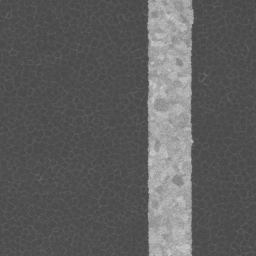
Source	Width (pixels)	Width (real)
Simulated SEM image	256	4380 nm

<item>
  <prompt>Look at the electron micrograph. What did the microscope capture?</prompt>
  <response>one or a few lines or trenches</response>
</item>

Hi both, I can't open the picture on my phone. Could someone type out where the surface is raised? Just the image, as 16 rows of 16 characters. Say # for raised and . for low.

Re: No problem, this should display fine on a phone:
.........###....
.........###....
.........###....
.........###....
.........###....
.........###....
.........###....
.........###....
.........###....
.........###....
.........###....
.........###....
.........###....
.........###....
.........###....
.........###....